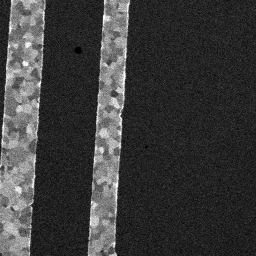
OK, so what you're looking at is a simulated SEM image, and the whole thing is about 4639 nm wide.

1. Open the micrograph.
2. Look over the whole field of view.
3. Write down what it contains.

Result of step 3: one or a few lines or trenches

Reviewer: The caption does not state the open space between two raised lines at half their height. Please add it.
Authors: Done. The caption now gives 1.06 microns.